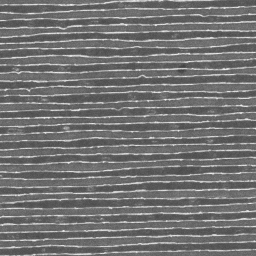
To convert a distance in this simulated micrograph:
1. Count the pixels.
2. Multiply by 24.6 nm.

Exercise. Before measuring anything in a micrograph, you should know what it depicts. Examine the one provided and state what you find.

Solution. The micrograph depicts parallel lines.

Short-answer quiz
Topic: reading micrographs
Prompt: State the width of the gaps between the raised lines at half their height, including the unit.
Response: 0.153 microns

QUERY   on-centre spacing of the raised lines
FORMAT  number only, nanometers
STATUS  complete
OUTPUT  372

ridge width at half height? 0.218 µm